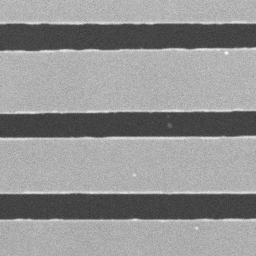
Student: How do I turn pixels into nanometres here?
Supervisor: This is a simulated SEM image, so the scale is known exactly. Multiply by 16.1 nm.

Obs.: lines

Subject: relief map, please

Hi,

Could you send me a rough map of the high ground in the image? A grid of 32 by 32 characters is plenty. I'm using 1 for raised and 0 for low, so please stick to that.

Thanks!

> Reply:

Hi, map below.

11111111111111111111111111111111
11111111111111111111111111111111
11111111111111111111111111111111
00000000000000000000000000000000
00000000000000000000000000000000
00000000000000000000000000000000
11111111111111111111111111111111
11111111111111111111111111111111
11111111111111111111111111111111
11111111111111111111111111111111
11111111111111111111111111111111
11111111111111111111111111111111
11111111111111111111111111111111
11111111111111111111111111111111
00000000000000000000000000000000
00000000000000000000000000000000
00000000000000000000000000000000
11111111111111111111111111111111
11111111111111111111111111111111
11111111111111111111111111111111
11111111111111111111111111111111
11111111111111111111111111111111
11111111111111111111111111111111
11111111111111111111111111111111
00000000000000000000000000000000
00000000000000000000000000000000
00000000000000000000000000000000
01110011000000001100000011111111
11111111111111111111111111111111
11111111111111111111111111111111
11111111111111111111111111111111
11111111111111111111111111111111